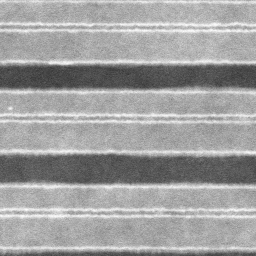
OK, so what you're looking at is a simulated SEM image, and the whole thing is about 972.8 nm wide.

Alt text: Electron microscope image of lines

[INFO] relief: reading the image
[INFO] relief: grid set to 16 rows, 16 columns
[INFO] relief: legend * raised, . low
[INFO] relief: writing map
****************
****************
****************
****************
................
................
****************
****************
****************
..**.***********
................
................
****************
****************
****************
****************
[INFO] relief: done